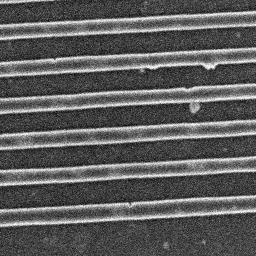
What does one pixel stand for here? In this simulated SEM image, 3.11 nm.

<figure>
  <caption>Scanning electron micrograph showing parallel lines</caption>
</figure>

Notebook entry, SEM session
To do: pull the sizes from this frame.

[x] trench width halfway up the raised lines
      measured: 0.0699 µm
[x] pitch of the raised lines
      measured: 0.115 um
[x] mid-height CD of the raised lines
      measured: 43.5 nm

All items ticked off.